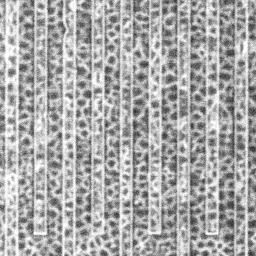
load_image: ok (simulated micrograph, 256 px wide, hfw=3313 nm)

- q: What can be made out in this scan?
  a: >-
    parallel lines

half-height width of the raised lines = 149 nm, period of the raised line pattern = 371 nm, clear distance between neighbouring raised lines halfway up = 0.218 microns